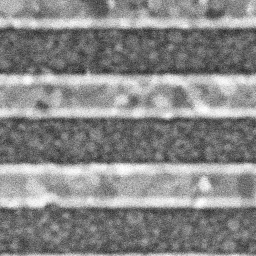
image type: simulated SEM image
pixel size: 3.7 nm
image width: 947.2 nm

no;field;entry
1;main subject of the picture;one or a few lines or trenches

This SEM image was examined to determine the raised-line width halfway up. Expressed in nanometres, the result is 131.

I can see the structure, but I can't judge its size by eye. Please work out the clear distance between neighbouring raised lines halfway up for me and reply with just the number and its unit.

202 nanometers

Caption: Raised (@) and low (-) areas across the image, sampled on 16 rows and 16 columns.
@@@@@@@@@@@@@@@@
@@@@@@@@@@@@@@--
----------------
----------------
----------------
@@@@@@@@@@@@@@@@
@@@@@@@@@@@@@@@@
----------------
----------------
----------------
-----@@-@@@@@@@@
@@@@@@@@@@@@@@@@
@@@@@@@@@@@@@@@@
----------------
----------------
----------------